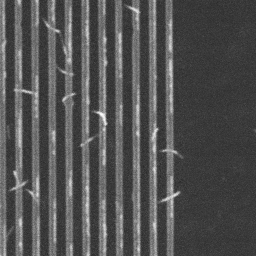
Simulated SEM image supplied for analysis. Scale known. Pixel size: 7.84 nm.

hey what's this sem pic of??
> parallel lines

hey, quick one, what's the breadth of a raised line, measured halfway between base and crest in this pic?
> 5.88 pixels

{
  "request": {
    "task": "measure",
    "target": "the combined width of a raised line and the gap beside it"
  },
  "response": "132 nm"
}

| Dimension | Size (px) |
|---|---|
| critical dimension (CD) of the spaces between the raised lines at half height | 10.6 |